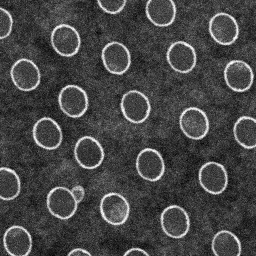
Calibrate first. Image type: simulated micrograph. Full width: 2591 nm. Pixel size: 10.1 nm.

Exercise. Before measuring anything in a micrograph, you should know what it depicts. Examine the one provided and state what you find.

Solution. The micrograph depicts a regular array of raised bodies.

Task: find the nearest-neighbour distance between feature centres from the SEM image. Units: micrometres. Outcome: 0.532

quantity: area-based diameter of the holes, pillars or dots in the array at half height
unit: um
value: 0.297